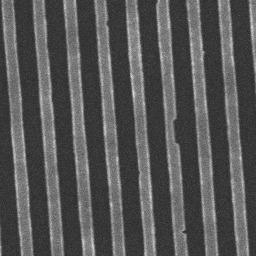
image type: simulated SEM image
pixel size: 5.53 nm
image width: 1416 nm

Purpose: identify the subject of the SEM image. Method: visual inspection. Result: parallel lines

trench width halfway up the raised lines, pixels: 20.2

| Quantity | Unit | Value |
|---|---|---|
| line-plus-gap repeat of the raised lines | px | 30.8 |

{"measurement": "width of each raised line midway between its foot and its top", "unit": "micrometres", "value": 0.0606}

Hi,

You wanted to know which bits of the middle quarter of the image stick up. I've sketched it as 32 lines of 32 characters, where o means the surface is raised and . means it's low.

.ooo.....ooo.....oo......oo.....
.ooo.....ooo.....oo.....ooo.....
.ooo.....ooo.....oo......oo.....
.ooo.....ooo.....ooo.....oo.....
.ooo.....ooo.....ooo.....oo.....
..oo.....ooo.....ooo.....oo.....
..oo.....ooo.....ooo.....oo.....
..oo......oo.....ooo.....oo.....
..ooo.....oo.....ooo.....ooo....
..oo......oo.....ooo.....ooo....
..oo......oo......oo.....ooo....
..ooo.....oo......oo.....ooo....
..ooo.....ooo.....oo......oo....
..ooo.....ooo.....oo.....ooo....
..ooo.....ooo.....oo.....oo.....
..ooo.....ooo.....oo......o.....
..ooo.....ooo.....oo......o.....
..ooo.....ooo.....oo......o.....
...oo.....ooo.....oo......o.....
...oo.....ooo.....ooo.....oo....
...oo.....ooo.....ooo.....oo....
...ooo.....oo.....ooo.....ooo...
...ooo.....oo.....ooo.....ooo...
...ooo.....oo......oo.....ooo...
...ooo.....oo......oo.....ooo...
...ooo.....oo......oo.....ooo...
...ooo.....oo......oo.....ooo...
...ooo.....ooo.....oo.....ooo...
...ooo.....ooo.....oo......oo...
....oo.....ooo.....oo......oo...
....oo.....ooo.....oo......oo...
....oo......oo.....oo......oo...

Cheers